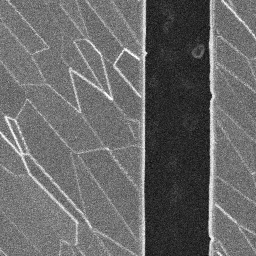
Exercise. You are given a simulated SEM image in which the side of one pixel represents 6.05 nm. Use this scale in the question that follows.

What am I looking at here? one or a few lines or trenches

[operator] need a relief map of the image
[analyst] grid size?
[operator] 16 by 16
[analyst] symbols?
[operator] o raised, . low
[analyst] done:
ooooooooo....ooo
ooooooooo....ooo
ooooooooo....ooo
ooooooooo....ooo
ooooooooo....ooo
ooooooooo....ooo
ooooooooo....ooo
ooooooooo....ooo
ooooooooo....ooo
ooooooooo....ooo
ooooooooo....ooo
ooooooooo....ooo
ooooooooo....ooo
ooooooooo....ooo
ooooooooo....ooo
ooooooooo....ooo